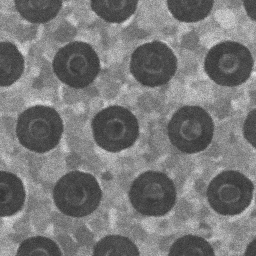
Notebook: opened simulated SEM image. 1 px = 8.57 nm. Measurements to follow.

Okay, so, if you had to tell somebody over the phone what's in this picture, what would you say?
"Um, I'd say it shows a regular array of ring-shaped grooves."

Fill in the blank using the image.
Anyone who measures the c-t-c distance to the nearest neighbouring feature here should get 643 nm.